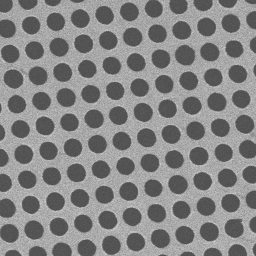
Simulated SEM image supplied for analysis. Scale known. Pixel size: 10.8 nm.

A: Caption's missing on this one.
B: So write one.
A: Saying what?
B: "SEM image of a regular array of holes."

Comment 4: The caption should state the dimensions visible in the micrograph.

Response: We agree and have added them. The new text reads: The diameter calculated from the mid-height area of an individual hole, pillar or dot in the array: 18.4 pixels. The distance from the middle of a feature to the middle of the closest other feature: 265 nm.